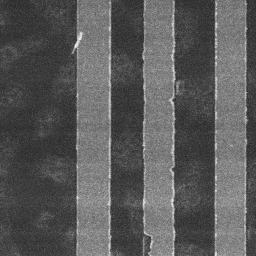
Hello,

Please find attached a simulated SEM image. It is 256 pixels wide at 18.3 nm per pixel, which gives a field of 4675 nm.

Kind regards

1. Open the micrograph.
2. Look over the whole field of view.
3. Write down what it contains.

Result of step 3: one or a few lines or trenches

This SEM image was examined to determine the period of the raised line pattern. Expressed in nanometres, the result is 1250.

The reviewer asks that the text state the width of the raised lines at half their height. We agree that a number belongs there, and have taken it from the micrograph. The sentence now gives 555 nanometres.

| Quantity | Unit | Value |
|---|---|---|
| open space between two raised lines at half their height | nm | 721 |